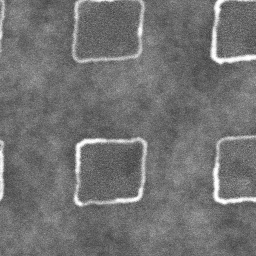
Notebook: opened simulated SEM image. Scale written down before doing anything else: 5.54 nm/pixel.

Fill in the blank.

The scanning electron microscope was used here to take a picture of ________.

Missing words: raised bodies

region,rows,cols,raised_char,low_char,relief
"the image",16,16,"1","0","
0000011110000011
0000011110000111
0000011110000111
0000011100000111
0000000000000000
0000000000000000
0000000000000000
0000000000000000
0000000000000001
0000011110000011
0000011110000111
0000011110000111
0000011100000011
0000000000000000
0000000000000000
0000000000000000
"